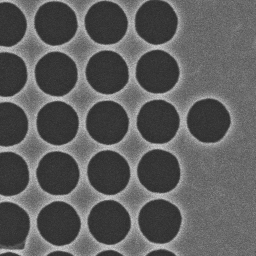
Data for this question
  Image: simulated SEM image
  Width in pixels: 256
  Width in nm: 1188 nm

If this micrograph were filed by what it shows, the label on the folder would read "a regular array of holes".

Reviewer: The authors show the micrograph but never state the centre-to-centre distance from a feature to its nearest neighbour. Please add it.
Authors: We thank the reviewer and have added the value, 231 nanometres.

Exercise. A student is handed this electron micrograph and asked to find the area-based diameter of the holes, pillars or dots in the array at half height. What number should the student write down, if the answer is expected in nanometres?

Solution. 204